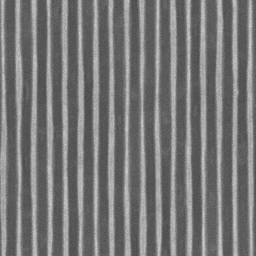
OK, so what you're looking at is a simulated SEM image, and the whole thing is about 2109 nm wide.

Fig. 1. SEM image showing parallel lines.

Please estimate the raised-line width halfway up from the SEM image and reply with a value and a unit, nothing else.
4.88 pixels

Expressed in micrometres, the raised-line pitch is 0.127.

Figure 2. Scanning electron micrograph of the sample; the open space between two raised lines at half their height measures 86.5 nm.